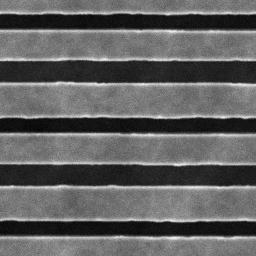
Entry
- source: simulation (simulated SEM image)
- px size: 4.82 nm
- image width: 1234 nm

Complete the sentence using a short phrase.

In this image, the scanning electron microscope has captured lines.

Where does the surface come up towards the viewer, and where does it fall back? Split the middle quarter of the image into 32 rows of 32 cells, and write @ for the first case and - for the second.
--------------------------------
--------------------------------
--------------------------------
--------------------------------
--------------------------------
@@@@@@@@@@@@@@@@@@@@@@@@@@@@@@@@
@@@@@@@@@@@@@@@@@@@@@@@@@@@@@@@@
@@@@@@@@@@@@@@@@@@@@@@@@@@@@@@@@
@@@@@@@@@@@@@@@@@@@@@@@@@@@@@@@@
@@@@@@@@@@@@@@@@@@@@@@@@@@@@@@@@
@@@@@@@@@@@@@@@@@@@@@@@@@@@@@@@@
@@@@@@@@@@@@@@@@@@@@@@@@@@@@@@@@
@@@@@@@@@@@@@@@@@@@@@@@@@@@@@@@@
----------------------@@@@@@@---
--------------------------------
--------------------------------
--------------------------------
@@@@@@@@@@@@@@@-@@@@-@@---------
@@@@@@@@@@@@@@@@@@@@@@@@@@@@@@@@
@@@@@@@@@@@@@@@@@@@@@@@@@@@@@@@@
@@@@@@@@@@@@@@@@@@@@@@@@@@@@@@@@
@@@@@@@@@@@@@@@@@@@@@@@@@@@@@@@@
@@@@@@@@@@@@@@@@@@@@@@@@@@@@@@@@
@@@@@@@@@@@@@@@@@@@@@@@@@@@@@@@@
@@@@@@@@@@@@@@@@@@@@@@@@@@@@@@@@
--------------------------------
--------------------------------
--------------------------------
--------------------------------
--------------------------------
--------------------------------
@@@@@@@@@@@@@@@@@@@@@@@@@@@@@@@@